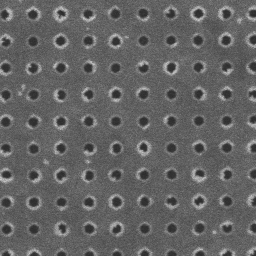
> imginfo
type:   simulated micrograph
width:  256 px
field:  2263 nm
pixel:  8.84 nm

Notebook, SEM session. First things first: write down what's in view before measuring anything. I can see a regular array of holes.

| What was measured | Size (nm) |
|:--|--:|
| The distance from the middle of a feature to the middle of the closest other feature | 235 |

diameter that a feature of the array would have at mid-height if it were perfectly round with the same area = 87 nm